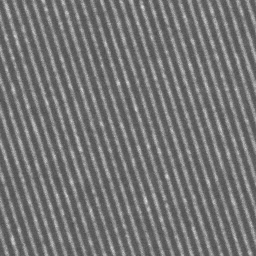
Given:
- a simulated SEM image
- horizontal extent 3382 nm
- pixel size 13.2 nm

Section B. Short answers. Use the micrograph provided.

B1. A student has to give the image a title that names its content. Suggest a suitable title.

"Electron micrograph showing parallel lines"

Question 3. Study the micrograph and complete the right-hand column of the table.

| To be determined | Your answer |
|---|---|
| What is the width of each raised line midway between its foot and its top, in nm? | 33.1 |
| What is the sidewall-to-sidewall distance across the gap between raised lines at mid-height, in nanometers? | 91.3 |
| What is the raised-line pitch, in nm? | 122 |